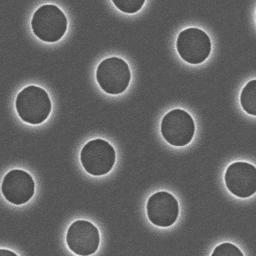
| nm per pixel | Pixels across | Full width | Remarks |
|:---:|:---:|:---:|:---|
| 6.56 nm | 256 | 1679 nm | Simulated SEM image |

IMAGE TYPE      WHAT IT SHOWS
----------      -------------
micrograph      a regular array of holes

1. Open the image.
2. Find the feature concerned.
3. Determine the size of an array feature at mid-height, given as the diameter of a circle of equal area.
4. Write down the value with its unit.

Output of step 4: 236 nanometers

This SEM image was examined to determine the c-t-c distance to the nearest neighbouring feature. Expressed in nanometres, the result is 544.